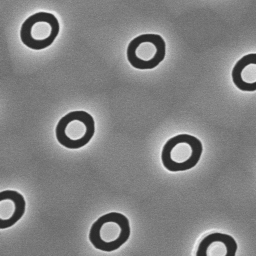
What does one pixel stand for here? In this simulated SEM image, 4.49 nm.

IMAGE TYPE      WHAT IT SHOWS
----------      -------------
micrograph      ring-shaped grooves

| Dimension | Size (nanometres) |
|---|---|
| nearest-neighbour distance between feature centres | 473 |